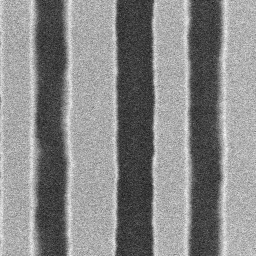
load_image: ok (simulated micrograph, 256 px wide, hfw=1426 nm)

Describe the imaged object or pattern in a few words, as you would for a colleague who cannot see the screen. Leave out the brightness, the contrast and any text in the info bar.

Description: lines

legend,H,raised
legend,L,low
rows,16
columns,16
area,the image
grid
HHLLHHHLLLHHLLHH
HHLLHHHLLLHHLLHH
HHLLHHHLLLHHLLHH
HHLLHHHLLLHHLLHH
HHLLHHHLLLHHLLHH
HHLLHHHLLLHHLLHH
HHLLHHHLLLHHLLHH
HHLLHHHLLLHHLLHH
HHLLHHHLLLHHLLHH
HHLLHHHLLLHHLLHH
HHLLHHHLLLHHLLHH
HHLLHHHLLLHHLLHH
HHLLHHHLLLHHLLHH
HHLLHHHLLLHHLLHH
HHLLHHHLLLHHLLHH
HHLLHHHLLLHHLLHH